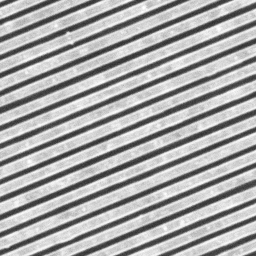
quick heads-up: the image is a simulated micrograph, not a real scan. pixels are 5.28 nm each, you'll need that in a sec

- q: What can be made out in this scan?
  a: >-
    parallel lines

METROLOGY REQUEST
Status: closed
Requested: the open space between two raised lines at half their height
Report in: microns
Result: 0.0372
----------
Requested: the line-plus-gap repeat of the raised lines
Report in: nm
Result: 86.5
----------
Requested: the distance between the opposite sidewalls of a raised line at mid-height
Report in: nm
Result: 46.3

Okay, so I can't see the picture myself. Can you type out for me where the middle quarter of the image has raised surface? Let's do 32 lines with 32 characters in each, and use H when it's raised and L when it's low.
LLLHHHHHHLLLLLHHHHHHLLLLLHHHHHLL
LHHHHHLLLLLLHHHHHLLLLLHHHHHHLLLL
HHHHLLLLLHHHHHHLLLLLHHHHHHLLLLHH
HLLLLLLHHHHHLLLLLLHHHHHLLLLLHHHH
LLLLHHHHHHLLLLLHHHHHHLLLLHHHHHHH
LLHHHHHLLLLLLHHHHHLLLLLHHHHHHLLL
HHHHHLLLLLHHHHHHLLLLLHHHHHHLLLLH
HHHLLLLHHHHHHLLLLLHHHHHHLLLLLHHH
LLLLLHHHHHLLLLLLHHHHHLLLLLLHHHHH
LLHHHHHHLLLLLHHHHHHLLLLLHHHHHHLL
HHHHHHLLLLLHHHHHLLLLLLHHHHHLLLLL
HHHLLLLLHHHHHHLLLLLHHHHHHLLLLLHH
HLLLLLHHHHHHLLLLLHHHHHLLLLLLHHHH
LLLLHHHHHLLLLLHHHHHHLLLLLHHHHHHL
LHHHHHHLLLLLHHHHHHLLLLLHHHHHLLLL
HHHHLLLLLLHHHHHLLLLLHHHHHHLLLLLH
HHLLLLLHHHHHHLLLLLHHHHHHLLLLLHHH
LLLLLHHHHHHLLLLLHHHHHLLLLLHHHHHH
LLHHHHHHLLLLLHHHHHHLLLLLHHHHHHLL
HHHHHHLLLLHHHHHHLLLLLLHHHHHLLLLL
HHHHLLLLHHHHHHLLLLLHHHHHHLLLLLHH
HLLLLLHHHHHLLLLLHHHHHHLLLLLLHHHH
LLLHHHHHHLLLLLHHHHHHLLLLLHHHHHHL
LHHHHHHLLLLLHHHHHLLLLLLHHHHHLLLL
HHHHLLLLLHHHHHHLLLLLHHHHHHLLLLLH
HHLLLLLHHHHHHLLLLLHHHHHLLLLLLHHH
LLLLLHHHHHLLLLLHHHHHLLLLLLHHHHHH
LLHHHHHHLLLLLHHHHHLLLLLLHHHHHLLL
HHHHHLLLLLLHHHHHLLLLLHHHHHHLLLLL
HHHLLLLLHHHHHLLLLLLHHHHHHLLLLHHH
LLLLLLHHHHHLLLLLLHHHHHLLLLLHHHHH
LLLHHHHHLLLLLLHHHHHHLLLLHHHHHHHL